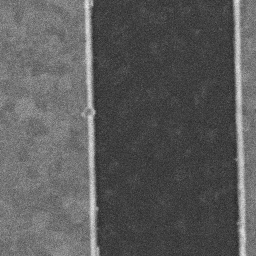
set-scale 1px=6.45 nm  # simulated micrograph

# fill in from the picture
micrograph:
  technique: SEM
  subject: one or a few lines or trenches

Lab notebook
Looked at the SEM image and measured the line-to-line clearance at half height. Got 965 nanometers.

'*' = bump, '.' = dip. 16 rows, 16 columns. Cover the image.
*****..........*
*****..........*
******.........*
******.........*
******.........*
******.........*
******.........*
******.........*
******.........*
******.........*
******.........*
******.........*
******.........*
******.........*
******.........*
******.........*